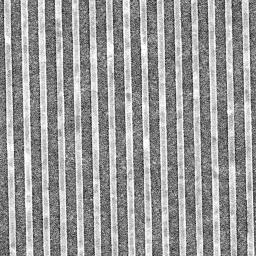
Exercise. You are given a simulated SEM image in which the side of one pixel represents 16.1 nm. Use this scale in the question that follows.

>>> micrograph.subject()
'parallel lines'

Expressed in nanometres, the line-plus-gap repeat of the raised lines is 273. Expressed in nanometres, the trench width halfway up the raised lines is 181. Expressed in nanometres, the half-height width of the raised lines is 86.3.